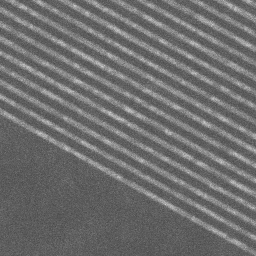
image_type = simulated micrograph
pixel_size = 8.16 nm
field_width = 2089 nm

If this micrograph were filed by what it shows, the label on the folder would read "parallel lines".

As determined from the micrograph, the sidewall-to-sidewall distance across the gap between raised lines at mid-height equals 69.6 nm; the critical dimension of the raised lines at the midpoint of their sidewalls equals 31.2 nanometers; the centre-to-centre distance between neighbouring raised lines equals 104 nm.